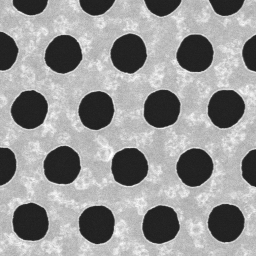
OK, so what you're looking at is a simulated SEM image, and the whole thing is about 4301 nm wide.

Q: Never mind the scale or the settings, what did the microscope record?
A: a regular array of holes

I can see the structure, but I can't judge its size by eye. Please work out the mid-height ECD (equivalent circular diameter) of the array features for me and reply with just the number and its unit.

634 nanometres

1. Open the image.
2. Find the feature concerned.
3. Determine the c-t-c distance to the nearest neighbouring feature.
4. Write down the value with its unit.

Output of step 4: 1.08 µm